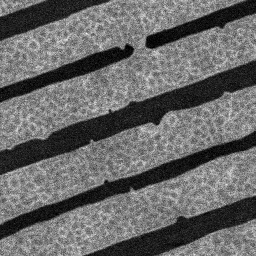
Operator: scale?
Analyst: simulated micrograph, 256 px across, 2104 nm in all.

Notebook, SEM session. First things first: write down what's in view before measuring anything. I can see one or a few lines or trenches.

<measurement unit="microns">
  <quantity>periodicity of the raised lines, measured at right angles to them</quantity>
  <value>0.519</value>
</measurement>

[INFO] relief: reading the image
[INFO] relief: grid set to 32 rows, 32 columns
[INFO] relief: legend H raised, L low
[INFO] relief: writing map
HHHHLLLLLLLLLHHHHHHHHHHHHHHHHLLL
HHLLLLLLLLHHHHHHHHHHHHHHHHHLLLLL
LLLLLLLLHHHHHHHHHHHHHHHHLLLLLLHH
LLLLLHHHHHHHHHHHHHHHHLLLLLLHHHHH
LLHHHHHHHHHHHHHHHHHLLLLLHHHHHHHH
HHHHHHHHHHHHHHHHHHLLLHHHHHHHHHHH
HHHHHHHHHHHHLLLLLHHHHHHHHHHHHHHH
HHHHHHHHHHLLLLLLHHHHHHHHHHHHHHHH
HHHHHHHLLLLLLHHHHHHHHHHHHHHHHLLL
HHHHLLLLLLHHHHHHHHHHHHHHHHLLLLLL
HLLLLLLHHHHHHHHHHHHHHHHHLLLLLLLL
LLLLHHHHHHHHHHHHHHHHHLLLLLLLLLHH
LHHHHHHHHHHHHHHHHHLLLLLLLLLHHHHH
HHHHHHHHHHHHHHHLLLLLLLLLHHHHHHHH
HHHHHHHHHHHHLLLLLLLLLHHHHHHHHHHH
HHHHHHHHHLLLLLLLLLLLHHHHHHHHHHHH
HHHHHHLLLLLLLLLHHHHHHHHHHHHHHHHL
HHHHLLLLLLLLLHHHHHHHHHHHHHHHHLLL
HLLLLLLLLLHHHHHHHHHHHHHHHHLLLLLL
LLLLLLLHHHHHHHHHHHHHHHHLLLLLHHHH
LLLLHHHHHHHHHHHHHHHHLLLLLLHHHHHH
LHHHHHHHHHHHHHHHHHLLLLLLHHHHHHHH
HHHHHHHHHHHHHHLLLLLLLHHHHHHHHHHH
HHHHHHHHHHHLLLLLLLHHHHHHHHHHHHHH
HHHHHHHHHLLLLLLHHHHHHHHHHHHHHHHL
HHHHHHLLLLLLHHHHHHHHHHHHHHHHHLLL
HHHLLLLLLHHHHHHHHHHHHHHHHLLLLLLL
HLLLLLLHHHHHHHHHHHHHHHLLLLLLLLLL
LLLHHHHHHHHHHHHHHHHHLLLLLLLLLHHH
LHHHHHHHHHHHHHHHHLLLLLLLLLHHHHHH
HHHHHHHHHHHHHHLLLLLLLLLLHHHHHHHH
HHHHHHHHHHHLLLLLLLLLLHHHHHHHHHHH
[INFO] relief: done